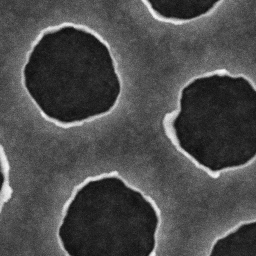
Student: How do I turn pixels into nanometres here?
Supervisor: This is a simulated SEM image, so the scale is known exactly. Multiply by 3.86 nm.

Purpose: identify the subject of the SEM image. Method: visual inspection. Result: holes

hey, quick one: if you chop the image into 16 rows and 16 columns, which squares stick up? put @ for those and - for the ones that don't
@@@@@@@@@@---@@@
@@@@@@@@@@@@@@@@
@@@---@@@@@@@@@@
@@-----@@@@@@@@@
@@-----@@@@@@@@@
@@-----@@@@@----
@@-----@@@@-----
@@@--@@@@@@-----
@@@@@@@@@@@-----
@@@@@@@@@@@@----
@@@@@@@@@@@@@-@@
@@@@@---@@@@@@@@
@@@@@----@@@@@@@
@@@@------@@@@@@
@@@@------@@@@--
@@@@------@@@---